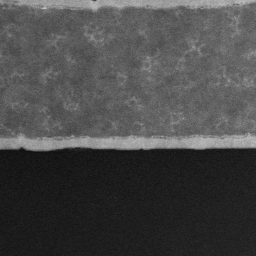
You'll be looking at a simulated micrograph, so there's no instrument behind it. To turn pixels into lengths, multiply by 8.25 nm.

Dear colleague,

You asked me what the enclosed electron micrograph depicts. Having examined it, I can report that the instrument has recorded one or a few lines or trenches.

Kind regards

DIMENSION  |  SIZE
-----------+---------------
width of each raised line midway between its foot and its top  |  1160 nm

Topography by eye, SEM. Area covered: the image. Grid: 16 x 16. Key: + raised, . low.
++++++++++++++++
++++++++++++++++
++++++++++++++++
++++++++++++++++
++++++++++++++++
++++++++++++++++
++++++++++++++++
++++++++++++++++
++++++++++++++++
................
................
................
................
................
................
................